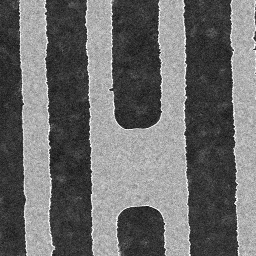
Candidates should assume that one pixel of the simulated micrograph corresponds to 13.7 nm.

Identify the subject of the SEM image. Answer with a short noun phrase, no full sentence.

one or a few lines or trenches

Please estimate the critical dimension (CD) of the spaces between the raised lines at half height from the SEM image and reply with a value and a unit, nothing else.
641 nanometres